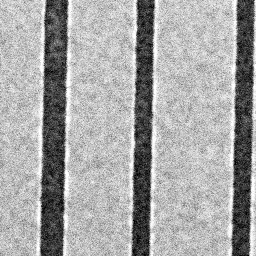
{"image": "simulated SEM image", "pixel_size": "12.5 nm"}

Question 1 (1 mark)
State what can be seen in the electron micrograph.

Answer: one or a few lines or trenches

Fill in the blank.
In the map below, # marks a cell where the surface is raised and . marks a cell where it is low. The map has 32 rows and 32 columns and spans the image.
######...########..##########...
######...########..##########...
#####....########..##########...
#####....########..##########...
#####....########..##########...
#####....########..##########...
#####....########..##########...
#####....########..##########...
#####....########..##########...
#####...#########..##########...
#####...#########..##########...
#####...#########..##########...
#####...#########..##########...
#####...#########..##########...
#####...#########..##########...
#####...#########..##########...
#####...#########..##########...
#####...#########..##########...
#####...#########..##########...
#####...#########..##########...
#####...#########..##########...
#####...#########..##########...
#####...########...##########...
#####...########...##########...
#####...#########..##########...
#####...#########..##########...
#####...########...##########..#
#####...########...##########..#
#####...########...##########..#
#####...########...##########..#
#####...########...##########..#
#####...########...##########..#